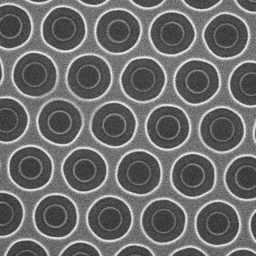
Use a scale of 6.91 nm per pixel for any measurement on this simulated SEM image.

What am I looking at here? an array of small figures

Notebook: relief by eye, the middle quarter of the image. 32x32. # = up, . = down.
#....##....#####........#####...
#...####....###...###....###....
#..######...##...#####...###...#
#..######...##...######..###...#
#...#####...##...######..###...#
#...####...####..#####...###...#
##.........####...###....###....
##........######........#####...
####....#########......#######..
..##########.######.###########.
...######.......########...#####
....####.........#####.......###
#...###..........#####........##
##...##...#####...###...####...#
##...##...#####...###..######..#
##...##...#####...###..######...
#...###...#####...###..######..#
....###....###...####...####...#
...#####.........####....##....#
..#######.......######........##
###########...#########......###
###....#########################
##.......#######......#########.
#.........#####........######...
...####...####....##....####....
...#####...###..#####...###...##
..######...##...######..###...##
...#####...##...######..###..###
...####...###...#####...###..###
#.........####...####...###...##
##.......#####.........####....#
###....########.......######....